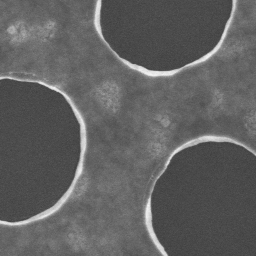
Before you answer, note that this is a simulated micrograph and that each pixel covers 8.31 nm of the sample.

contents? holes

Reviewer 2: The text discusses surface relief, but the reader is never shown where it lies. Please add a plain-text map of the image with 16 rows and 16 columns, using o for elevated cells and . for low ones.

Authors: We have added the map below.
oooooo.........o
oooooo........oo
ooooooo.......oo
ooooooo......ooo
oooooooooooooooo
...ooooooooooooo
....oooooooooooo
.....ooooooooooo
.....ooooooooooo
.....oooooo.....
.....ooooo......
.....ooooo......
....ooooo.......
...oooooo.......
oooooooooo......
oooooooooo......